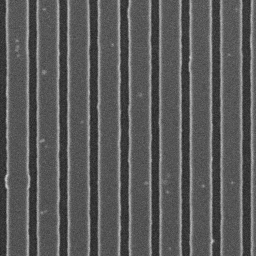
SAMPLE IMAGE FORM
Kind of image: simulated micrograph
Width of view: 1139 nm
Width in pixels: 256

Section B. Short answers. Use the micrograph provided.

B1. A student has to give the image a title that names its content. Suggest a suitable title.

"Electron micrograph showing parallel lines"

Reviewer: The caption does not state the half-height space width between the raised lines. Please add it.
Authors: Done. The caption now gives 37.9 nanometres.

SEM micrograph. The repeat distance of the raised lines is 0.136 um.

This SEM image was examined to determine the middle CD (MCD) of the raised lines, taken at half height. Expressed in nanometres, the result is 98.5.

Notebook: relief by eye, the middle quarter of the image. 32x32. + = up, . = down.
.+++++...+++++..++++++..+++++..+
.+++++...+++++..++++++..+++++..+
.+++++...+++++..++++++..+++++...
.+++++...+++++..++++++..+++++...
.+++++...+++++..++++++..+++++...
.+++++...+++++..++++++..+++++...
.+++++...+++++..++++++..+++++...
.+++++...+++++..++++++..+++++...
.+++++...+++++..++++++..+++++...
.+++++...+++++..++++++..+++++...
.+++++..++++++..++++++..+++++...
.+++++..++++++..++++++..+++++...
.+++++...+++++..++++++..+++++...
.+++++...+++++..++++++..+++++...
.+++++...+++++..++++++..+++++...
.+++++...+++++..++++++..+++++...
.+++++...+++++..++++++..+++++...
.+++++...+++++..++++++..+++++...
.+++++...+++++..++++++..+++++...
.+++++...+++++...+++++..+++++...
.+++++...+++++..++++++..+++++...
.+++++...+++++..++++++..+++++...
.+++++...+++++..++++++..+++++...
.+++++...+++++..++++++..+++++...
.+++++...+++++..++++++..+++++...
.+++++...+++++..++++++..+++++...
.+++++...+++++..++++++..+++++...
.+++++...+++++..++++++..+++++...
.+++++...+++++..++++++..+++++...
.+++++...+++++..++++++..+++++...
.+++++...+++++..++++++..+++++...
.+++++...+++++..++++++..+++++...